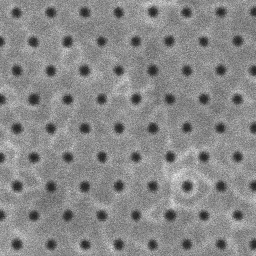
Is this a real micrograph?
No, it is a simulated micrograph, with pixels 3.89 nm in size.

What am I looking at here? a regular array of holes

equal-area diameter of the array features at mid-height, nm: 42.8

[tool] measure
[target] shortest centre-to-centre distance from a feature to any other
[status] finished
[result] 129 nanometres